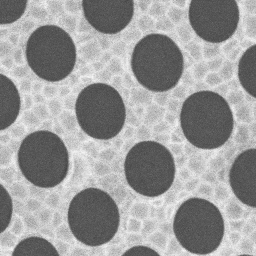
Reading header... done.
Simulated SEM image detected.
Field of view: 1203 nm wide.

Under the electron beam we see a regular array of holes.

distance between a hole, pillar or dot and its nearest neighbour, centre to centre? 74.6 pixels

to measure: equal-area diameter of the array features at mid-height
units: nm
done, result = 255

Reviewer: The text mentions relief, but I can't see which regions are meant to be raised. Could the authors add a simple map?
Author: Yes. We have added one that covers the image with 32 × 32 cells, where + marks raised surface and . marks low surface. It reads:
...+++++++.......+++++++......++
...+++++++.......+++++++......++
..+++++++++.....++++++++......++
+++++...++++....++++++++......++
++++.....+++++++++...++++....+++
+++......++++++++.....++++++++++
+++......++++++++......++++++++.
+++......+++++++.......+++++++..
++++.....+++++++.......+++++++..
.++++...+++++++++......+++++++..
..+++++++++..+++++....++++++++..
..++++++++.....++++++++++..++++.
...+++++++.....++++++++.....++++
...++++++.......+++++++......+++
..++++++++......++++++.......+++
..++++++++.....++++++++......+++
++++..+++++....++++++++......+++
+++.....+++++++++++++++.....++++
++......++++++++.....++++..+++++
++.......+++++++......++++++++..
++.......+++++++......+++++++...
+++.....++++++++......+++++++...
+++.....++++++++......+++++++...
.++++++++++.+++++....++++++++...
.++++++++.....++++..++++++++++..
..+++++++......++++++++....++++.
..+++++++......+++++++......++++
.+++++++.......+++++++......++++
.++++++++......+++++++......++++
+++++++++.....++++++++......++++
++....+++++..++++++++++.....++++
++.....+++++++++....++++...+++++